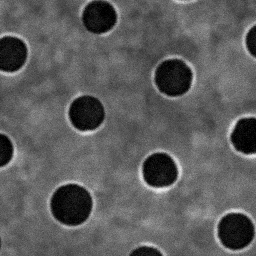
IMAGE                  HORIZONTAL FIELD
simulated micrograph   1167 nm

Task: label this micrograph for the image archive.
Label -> holes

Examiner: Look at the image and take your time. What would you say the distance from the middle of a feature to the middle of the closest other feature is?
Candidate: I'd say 423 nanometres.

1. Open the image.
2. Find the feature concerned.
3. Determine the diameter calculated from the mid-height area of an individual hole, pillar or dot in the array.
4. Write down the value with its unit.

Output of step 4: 173 nm